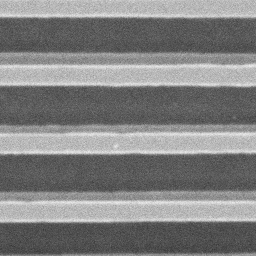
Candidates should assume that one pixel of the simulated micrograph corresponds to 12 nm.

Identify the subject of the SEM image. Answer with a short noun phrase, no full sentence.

lines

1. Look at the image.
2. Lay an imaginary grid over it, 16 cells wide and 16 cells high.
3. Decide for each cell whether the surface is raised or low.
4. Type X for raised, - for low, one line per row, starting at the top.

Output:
XXXXXXXXXXXXXXXX
----------------
----------------
XXXXXXXXXXXXXXXX
XXXXXXXXXXXXXXXX
----------------
----------------
----------------
XXXXXXXXXXXXXXXX
XXXXXXXXXXXXXXXX
----------------
----------------
XXXXXXXXXXXXXXXX
XXXXXXXXXXXXXXXX
----------------
----------------